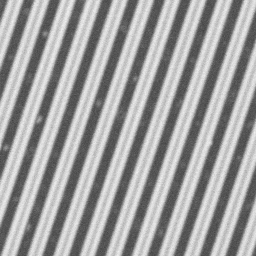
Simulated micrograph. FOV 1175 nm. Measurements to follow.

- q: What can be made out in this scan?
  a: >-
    parallel lines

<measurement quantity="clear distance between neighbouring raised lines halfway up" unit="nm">64.2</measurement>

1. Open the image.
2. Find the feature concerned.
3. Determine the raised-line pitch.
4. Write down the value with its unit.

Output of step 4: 114 nm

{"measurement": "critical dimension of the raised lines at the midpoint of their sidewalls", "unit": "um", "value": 0.0484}